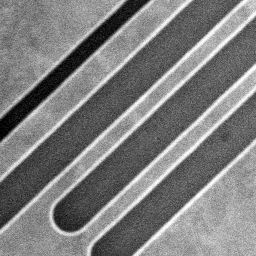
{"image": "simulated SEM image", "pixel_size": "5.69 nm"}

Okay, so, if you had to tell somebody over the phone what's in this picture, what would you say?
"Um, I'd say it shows groups of lines, slits or small figures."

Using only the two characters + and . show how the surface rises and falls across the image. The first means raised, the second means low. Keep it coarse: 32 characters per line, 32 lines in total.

+++++++++++++++...+++++.......++
++++++++++++++...+++++.......+++
+++++++++++++...+++++.......+++.
++++++++++++...+++++.......+++..
+++++++++++...+++++.......+++...
++++++++++...+++++.......+++....
+++++++++...+++++.......+++.....
++++++++...+++++.......+++......
+++++++...+++++.......+++.......
++++++...+++++.......+++.......+
+++++...+++++.......+++......+++
++++...+++++.......+++......++++
++....+++++......++++......++++.
+....+++++......++++......+++...
....+++++......++++......+++....
...+++++......+++.......+++.....
.+++++.......+++.......+++......
+++++.......+++.......+++.......
++++.......+++.......+++.......+
+++.......+++.......+++.......++
++.......+++.......+++.......+++
+.......+++.......+++.......++++
.......+++.......+++.......+++++
......+++.......+++.......++++++
.....+++.......+++.......+++++++
....+++.......+++.......++++++++
...++++......+++.......+++++++++
..+++++.....+++......+++++++++++
+++++++...++++......++++++++++++
+++++++++++++......+++++++++++++
++++++++++++......++++++++++++++
+++++++++++......+++++++++++++++